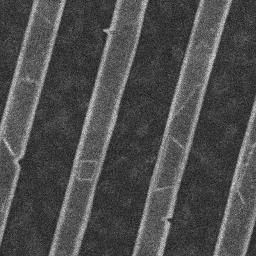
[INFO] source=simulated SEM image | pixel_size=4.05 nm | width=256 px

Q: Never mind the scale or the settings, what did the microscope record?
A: one or a few lines or trenches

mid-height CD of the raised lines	101	nanometres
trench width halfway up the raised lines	221	nanometers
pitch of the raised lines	323	nanometres